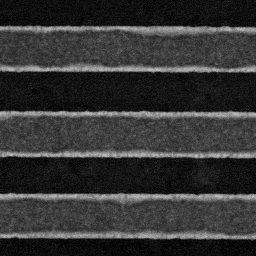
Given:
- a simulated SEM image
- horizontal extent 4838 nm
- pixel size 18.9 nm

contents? lines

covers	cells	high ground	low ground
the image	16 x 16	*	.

................
................
****************
****************
................
................
................
****************
****************
****************
................
................
****************
****************
****************
................